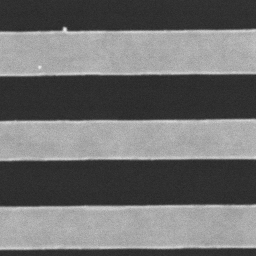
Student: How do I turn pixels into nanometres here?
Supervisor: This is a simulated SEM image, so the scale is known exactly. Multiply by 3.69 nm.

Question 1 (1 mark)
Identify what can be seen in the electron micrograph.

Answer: wiring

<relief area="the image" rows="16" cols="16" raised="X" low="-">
----------------
----------------
XXXXXXXXXXXXXXXX
XXXXXXXXXXXXXXXX
XXXXXXXXXXXXXXXX
----------------
----------------
---------------X
XXXXXXXXXXXXXXXX
XXXXXXXXXXXXXXXX
----------------
----------------
----------------
XXXXXXXXXXXXXXXX
XXXXXXXXXXXXXXXX
XXXXXXXXXXXXXX--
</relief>